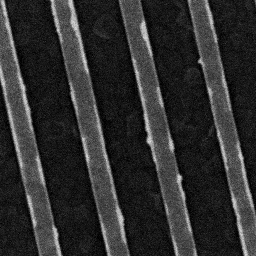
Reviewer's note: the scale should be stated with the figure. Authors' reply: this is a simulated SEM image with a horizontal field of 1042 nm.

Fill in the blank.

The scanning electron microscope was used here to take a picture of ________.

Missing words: one or a few lines or trenches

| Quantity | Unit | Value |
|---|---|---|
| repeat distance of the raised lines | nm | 271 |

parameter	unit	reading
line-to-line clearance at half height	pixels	45.7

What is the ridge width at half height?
0.085 microns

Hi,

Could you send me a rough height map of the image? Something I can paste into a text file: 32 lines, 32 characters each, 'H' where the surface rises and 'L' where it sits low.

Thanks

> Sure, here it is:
HLLLLLHHHLLLLLLHHHLLLLLLHHLLLLLL
HLLLLLLHHLLLLLLHHHLLLLLLHHLLLLLL
HLLLLLLHHHLLLLLHHHLLLLLLHHHLLLLL
HLLLLLLHHHLLLLLLHHLLLLLLHHHLLLLL
HLLLLLLHHHLLLLLLHHHLLLLLLHHLLLLL
HHLLLLLLHHLLLLLLHHHLLLLLLHHLLLLL
HHLLLLLLHHLLLLLLHHHLLLLLLHHLLLLL
HHLLLLLLHHHLLLLLLHHLLLLLLHHHLLLL
HHLLLLLLHHHLLLLLLHHLLLLLLHHHLLLL
HHHLLLLLHHHLLLLLLHHHLLLLLLHHLLLL
HHHLLLLLLHHLLLLLLHHHLLLLLLHHLLLL
HHHLLLLLLHHHLLLLLHHHLLLLLLHHHLLL
LHHLLLLLLHHHLLLLLLHHLLLLLLHHHLLL
LHHHLLLLLHHHLLLLLLHHLLLLLLLHHLLL
LHHHLLLLLLHHLLLLLLHHHLLLLLLHHLLL
LHHHLLLLLLHHLLLLLLHHHLLLLLLHHLLL
LHHHLLLLLLHHHLLLLLHHHLLLLLLHHHLL
LLHHLLLLLLHHHLLLLLHHHLLLLLLHHHLL
LLHHHLLLLLHHHLLLLLLHHHLLLLLLHHLL
LLHHHLLLLLLHHLLLLLLHHHLLLLLLHHLL
LLHHHLLLLLLHHHLLLLLHHHLLLLLLHHLL
LLLHHLLLLLLHHHLLLLLLHHLLLLLLHHHL
LLLHHLLLLLLHHHLLLLLLHHHLLLLLLHHL
LLLHHHLLLLLLHHLLLLLLHHHLLLLLLHHL
LLLHHHLLLLLLHHLLLLLLHHHLLLLLLHHL
LLLLHHLLLLLLHHHLLLLLLHHLLLLLLHHH
LLLLHHLLLLLLHHHLLLLLLHHLLLLLLHHH
LLLLHHHLLLLLHHHLLLLLLHHHLLLLLLHH
LLLLHHHLLLLLLHHLLLLLLHHHLLLLLLHH
LLLLHHHLLLLLLHHHLLLLLHHHLLLLLLHH
LLLLLHHLLLLLLHHHLLLLLLHHLLLLLLHH
LLLLLHHHLLLLLHHHLLLLLLHHHLLLLLHH